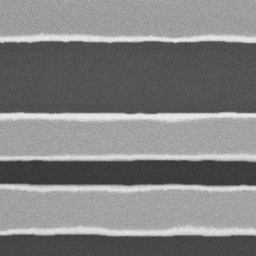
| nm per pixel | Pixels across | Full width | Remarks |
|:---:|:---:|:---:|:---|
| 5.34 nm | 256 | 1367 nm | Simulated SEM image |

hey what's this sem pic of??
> lines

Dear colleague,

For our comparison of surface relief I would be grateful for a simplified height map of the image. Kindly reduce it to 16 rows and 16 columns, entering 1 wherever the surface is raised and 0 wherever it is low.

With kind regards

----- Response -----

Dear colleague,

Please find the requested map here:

1111111111111111
1111111111111111
1111111111111011
0000000000000000
0000000000000000
0000000000000000
0000000000000000
1111111111111111
1111111111111111
1111111111111111
0000000000000000
0000000000000000
1111111111111111
1111111111111111
1111111111111111
0000000000000000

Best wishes